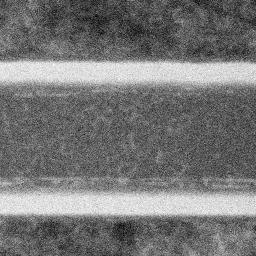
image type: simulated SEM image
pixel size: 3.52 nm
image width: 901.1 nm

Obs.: one or a few lines or trenches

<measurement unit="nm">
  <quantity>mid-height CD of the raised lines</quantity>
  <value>465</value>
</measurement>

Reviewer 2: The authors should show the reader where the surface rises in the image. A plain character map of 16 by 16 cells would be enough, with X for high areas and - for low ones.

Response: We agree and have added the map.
----------------
----------------
----------------
----------------
--X-----XXX-----
XXXXXXXXXXXXXXXX
XXXXXXXXXXXXXXXX
XXXXXXXXXXXXXXXX
XXXXXXXXXXXXXXXX
XXXXXXXXXXXXXXXX
XXXXXXXXXXXXXXXX
XXXXXXXXXXXXXXXX
XXXXXXXXXXXXXXXX
----------------
----------------
----------------